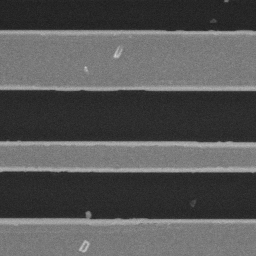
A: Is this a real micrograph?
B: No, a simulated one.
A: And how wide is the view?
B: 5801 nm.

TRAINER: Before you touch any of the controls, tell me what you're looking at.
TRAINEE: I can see lines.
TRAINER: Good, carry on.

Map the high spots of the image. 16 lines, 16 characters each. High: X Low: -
----------------
----------------
XXXXXXXXXXXXXXXX
XXXXXXXXXXXXXXXX
XXXXXXXXXXXXXXXX
XXXXXXXXXXXXXXXX
----------------
----------------
----------------
XXXXXXXXXXXXXXXX
XXXXXXXXXXXXXXXX
----------------
----------------
----------------
XXXXXXXXXXXXXXXX
XXXXXXXXXXXXXXXX